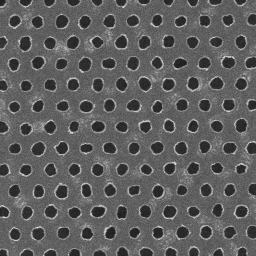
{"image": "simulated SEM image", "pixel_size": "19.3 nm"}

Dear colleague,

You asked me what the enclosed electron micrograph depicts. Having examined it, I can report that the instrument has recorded a regular array of holes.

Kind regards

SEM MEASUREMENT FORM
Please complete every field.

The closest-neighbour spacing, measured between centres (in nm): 451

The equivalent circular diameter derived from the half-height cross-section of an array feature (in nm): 226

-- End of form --